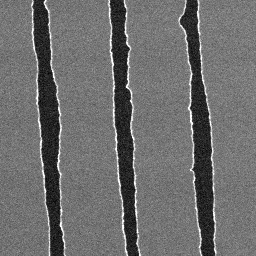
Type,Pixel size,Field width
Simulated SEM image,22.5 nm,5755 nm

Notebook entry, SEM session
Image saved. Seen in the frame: one or a few lines or trenches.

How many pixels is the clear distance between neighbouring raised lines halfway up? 59.6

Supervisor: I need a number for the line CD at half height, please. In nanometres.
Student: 364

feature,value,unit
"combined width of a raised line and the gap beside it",1700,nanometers